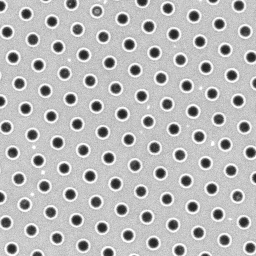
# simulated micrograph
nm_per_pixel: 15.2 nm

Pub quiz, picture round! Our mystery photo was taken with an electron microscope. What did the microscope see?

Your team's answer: a regular array of raised bodies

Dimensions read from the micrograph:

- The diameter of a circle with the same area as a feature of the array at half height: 204 nanometres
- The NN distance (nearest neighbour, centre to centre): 400 nanometers